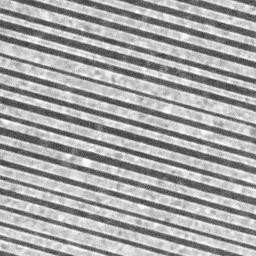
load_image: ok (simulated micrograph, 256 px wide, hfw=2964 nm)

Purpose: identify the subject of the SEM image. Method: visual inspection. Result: parallel lines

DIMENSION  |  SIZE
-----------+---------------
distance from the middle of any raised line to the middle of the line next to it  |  170 nanometers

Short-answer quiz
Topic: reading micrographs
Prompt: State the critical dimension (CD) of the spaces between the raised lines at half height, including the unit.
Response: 80.9 nanometres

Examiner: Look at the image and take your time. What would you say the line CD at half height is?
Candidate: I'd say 7.47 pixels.